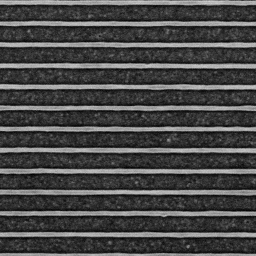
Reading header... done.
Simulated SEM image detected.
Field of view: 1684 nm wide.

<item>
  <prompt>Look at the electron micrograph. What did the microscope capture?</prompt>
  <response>parallel lines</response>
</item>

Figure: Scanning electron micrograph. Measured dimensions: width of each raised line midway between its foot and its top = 3.63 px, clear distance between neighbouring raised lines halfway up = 114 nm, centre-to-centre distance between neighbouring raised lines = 139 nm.